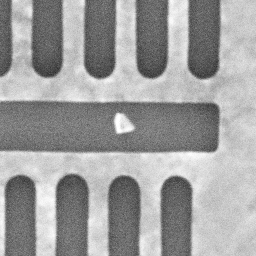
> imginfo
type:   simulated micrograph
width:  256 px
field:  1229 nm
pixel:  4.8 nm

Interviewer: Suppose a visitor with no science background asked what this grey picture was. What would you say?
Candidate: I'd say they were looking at groups of lines, slits or small figures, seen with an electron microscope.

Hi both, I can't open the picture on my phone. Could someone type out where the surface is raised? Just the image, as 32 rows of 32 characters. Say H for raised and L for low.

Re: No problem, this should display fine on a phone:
LLHHLLLLHHLLLLLHHLLLLHHLLLLLHHHH
LLHHLLLLHHLLLLLHHLLLLHHLLLLLHHHH
LLHHLLLLHHLLLLLHHLLLLHHLLLLLHHHH
LLHHLLLLHHLLLLLHHLLLLHHLLLLLHHHH
LLHHLLLLHHLLLLLHHLLLLHHLLLLLHHHH
LLHHLLLLHHLLLLLHHLLLLHHLLLLLHHHH
LLHHLLLLHHLLLLLHHLLLLHHLLLLLHHHH
LLHHLLLLHHLLLLLHHLLLLHHLLLLLHHHH
LHHHLLLLHHHLLLHHHLLLLHHHLLLHHHHH
LHHHHLLHHHHLLLHHHHLLHHHHLLLHHHHH
HHHHHHHHHHHHHHHHHHHHHHHHHHHHHHHH
HHHHHHHHHHHHHHHHHHHHHHHHHHHHHHHH
LLLLLLLLHHHHHHHHHHHHHHHHHHHHHHHH
LLLLLLLLLLLLLLLLLLLLLLLLLLLHHHHH
LLLLLLLLLLLLLLLLLLLLLLLLLLLLHHHH
LLLLLLLLLLLLLLLLLLLLLLLLLLLLHHHH
LLLLLLLLLLLLLLLLLLLLLLLLLLLLHHHH
LLLLLLLLLLLLLLLLLLLLLLLLLLLLHHHH
LLLLLLLLLLLLLLLLLLLLLLLLLLLHHHHH
HHHHHHHHHHHHHHHHHHHHHHHHHHHHHHHH
HHHHHHHHHHHHHHHHHHHHHHHHHHHHHHHH
HHHHHHHHHHHHHHHHHHHHHHHHHHHHHHHH
HLLLHHHLLLLHHHLLLHHHHLLHHHHHHHHH
HLLLLHHLLLLHHHLLLHHHLLLLHHHHHHHH
LLLLLHHLLLLHHLLLLLHHLLLLHHHHHHHH
LLLLLHHLLLLHHLLLLLHHLLLLHHHHHHHH
LLLLLHHLLLLHHLLLLLHHLLLLHHHHHHHH
LLLLLHHLLLLHHLLLLLHHLLLLHHHHHHHH
LLLLLHHLLLLHHLLLLLHHLLLLHHHHHHHH
LLLLLHHLLLLHHLLLLLHHLLLLHHHHHHHH
LLLLLHHLLLLHHLLLLLHHLLLLHHHHHHHH
LLLLLHHLLLLHHLLLLLHHLLLLHHHHHHHH